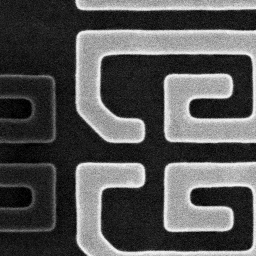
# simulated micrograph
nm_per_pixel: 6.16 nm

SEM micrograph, wiring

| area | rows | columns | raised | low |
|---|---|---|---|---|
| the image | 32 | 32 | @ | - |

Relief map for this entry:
----------@@@@@@@@@@@@@@@@@@@@@@
--------------------------------
--------------------------------
--------------------------------
----------@@@@@@@@@@@@@@@@@@@@@@
----------@@@@@@@@@@@@@@@@@@@@@@
----------@@@@@@@@@@@@@@@@@@@@@@
----------@@@-------------------
----------@@@-------------------
@@@@@@----@@---------@@@@@@@@---
@@@@@@@---@@---------@@@@@@@@---
@@@@@@@---@@---------@@@@@@@@---
---@@@@---@@@--------@@@--------
----@@@---@@@--------@@@--------
----@@@---@@@@-------@@@-------@
@@@@@@@----@@@@@@@---@@@@@@@@@@@
@@@@@@@-----@@@@@@---@@@@@@@@@@@
@@@@@@@------@@@@@---@@@@@@@@@@@
--------------------------------
--------------------------------
@@@@@@----@@@@@@@@---@@@@@@@@@@@
@@@@@@@---@@@@@@@@---@@@@@@@@@@@
@@@@@@@---@@@@@@@@---@@@@@@@@@@@
---@@@@---@@@@-------@@@@------@
----@@@---@@@--------@@@--------
----@@@---@@@--------@@@--------
@@@@@@@---@@@--------@@@@@@@@---
@@@@@@@---@@@--------@@@@@@@@---
@@@@@@@---@@@--------@@@@@@@@---
----------@@@-------------------
----------@@@@------------------
-----------@@@@@--@@@@--@@@@@@@@